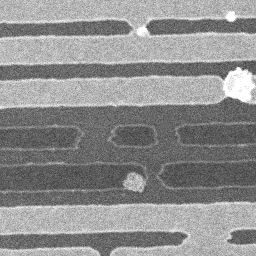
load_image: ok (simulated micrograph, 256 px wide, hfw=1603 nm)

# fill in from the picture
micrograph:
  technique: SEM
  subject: parallel lines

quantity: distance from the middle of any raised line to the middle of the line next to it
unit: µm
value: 0.265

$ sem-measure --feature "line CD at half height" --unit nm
165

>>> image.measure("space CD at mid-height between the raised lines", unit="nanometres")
98.5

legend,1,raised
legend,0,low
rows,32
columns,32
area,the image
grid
11111111111111111111111111111111
11111111111111111111111111111111
11111111111100011110000000000000
00000000000000001100000000000000
00000000000000001110011111111111
11111111111111111111111111111111
11111111111111111111111111111111
11111111111111111111111111111100
00000000000000000000000000000000
00000000000000000000000000001111
11111111111111111111111111111111
11111111111111111111111111111111
11111111111111111111111111110011
00000000000000000000000000000000
00000000000000000000000000000000
00000000000000000000000001110111
11111111110000111110001111111111
11111111110000111111001111111111
11111111100000000000000000000000
00000000000000000000000000000000
00000111000111101000011111111111
11111111111111111100111111111111
11111111111111111100111111111111
11111111111111111100011110000000
00000000000000000000000000000000
00000000000000000000000000111111
11111111111111111111111111111111
11111111111111111111111111111111
11111111111111111111111111111111
00000000000000000000000111111000
00000000000000000000000111111000
11111111111100111111111111111111